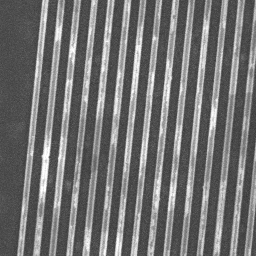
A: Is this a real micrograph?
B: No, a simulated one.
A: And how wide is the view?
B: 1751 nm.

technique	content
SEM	parallel lines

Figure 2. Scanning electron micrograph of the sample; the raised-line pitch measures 111 nm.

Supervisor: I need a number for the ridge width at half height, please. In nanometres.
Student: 38.3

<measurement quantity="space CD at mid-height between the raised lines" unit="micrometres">0.0757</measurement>